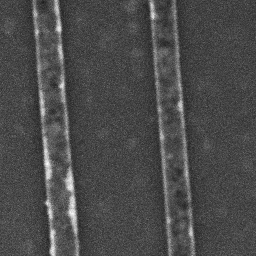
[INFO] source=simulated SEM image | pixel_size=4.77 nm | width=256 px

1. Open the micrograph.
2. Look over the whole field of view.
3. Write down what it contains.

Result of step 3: one or a few lines or trenches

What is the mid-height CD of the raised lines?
0.117 micrometres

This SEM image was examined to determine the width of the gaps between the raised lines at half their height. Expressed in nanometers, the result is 436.